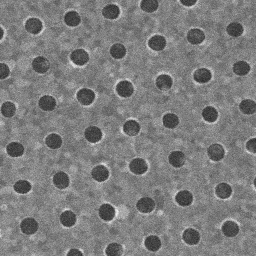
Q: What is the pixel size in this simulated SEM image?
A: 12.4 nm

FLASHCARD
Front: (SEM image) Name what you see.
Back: a regular array of holes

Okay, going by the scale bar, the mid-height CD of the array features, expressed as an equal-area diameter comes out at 218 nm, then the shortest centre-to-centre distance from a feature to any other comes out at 0.482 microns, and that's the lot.